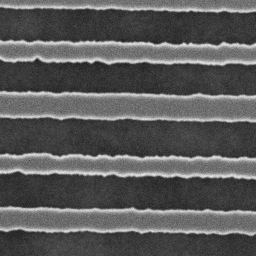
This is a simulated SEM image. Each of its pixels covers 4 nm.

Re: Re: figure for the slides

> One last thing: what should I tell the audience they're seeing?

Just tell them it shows lines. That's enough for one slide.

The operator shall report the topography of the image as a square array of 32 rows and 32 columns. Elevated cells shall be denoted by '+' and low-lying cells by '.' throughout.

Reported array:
++++++++++++++++++++++++++++++++
.............................+++
................................
................................
................................
+++++++++++++++++++.+..+........
++++++++++++++++++++++++++++++++
++++.+++++++++++++++++++++++++++
................................
................................
................................
+...............................
++++++++++++++++++++++++++++++++
++++++++++++++++++++++++++++++++
++++++++++++++++++++++++++++++++
................................
................................
................................
................................
+++++++.+++.++.+................
++++++++++++++++++++++++++++++++
++.+++++++++++++++++++++++++++++
................................
................................
................................
................................
++++++++++++++++++++++++++++++++
++++++++++++++++++++++++++++++++
++++++++++++++++++++++++++++++++
................................
................................
................................